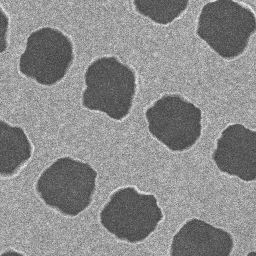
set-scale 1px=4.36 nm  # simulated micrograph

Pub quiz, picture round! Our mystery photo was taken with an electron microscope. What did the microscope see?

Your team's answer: holes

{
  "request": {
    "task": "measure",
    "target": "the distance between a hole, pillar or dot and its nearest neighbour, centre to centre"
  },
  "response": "306 nm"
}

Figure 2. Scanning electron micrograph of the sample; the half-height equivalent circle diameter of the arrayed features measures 241 nm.